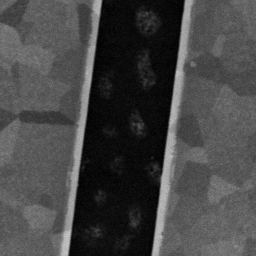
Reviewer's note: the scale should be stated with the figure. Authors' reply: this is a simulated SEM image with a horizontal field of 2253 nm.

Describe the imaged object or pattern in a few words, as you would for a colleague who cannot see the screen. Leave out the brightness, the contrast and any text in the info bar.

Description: one or a few lines or trenches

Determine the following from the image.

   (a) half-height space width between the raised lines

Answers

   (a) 783 nm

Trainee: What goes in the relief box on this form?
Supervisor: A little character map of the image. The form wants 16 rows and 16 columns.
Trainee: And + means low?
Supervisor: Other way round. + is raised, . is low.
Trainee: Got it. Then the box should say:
++++++......++++
++++++......++++
++++++.....+++++
++++++.....+++++
++++++.....+++++
+++++......+++++
+++++......+++++
+++++......+++++
+++++......+++++
+++++......+++++
+++++.....++++++
+++++.....++++++
+++++.....++++++
++++......++++++
++++......++++++
++++......++++++